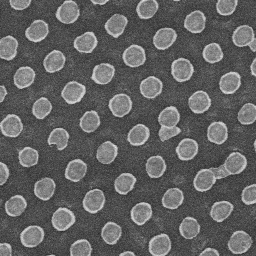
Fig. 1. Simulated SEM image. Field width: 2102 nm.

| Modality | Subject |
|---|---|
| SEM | a regular array of raised bodies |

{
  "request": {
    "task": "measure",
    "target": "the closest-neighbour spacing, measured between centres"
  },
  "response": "285 nm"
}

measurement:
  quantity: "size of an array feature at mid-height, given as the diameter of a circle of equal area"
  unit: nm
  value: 165